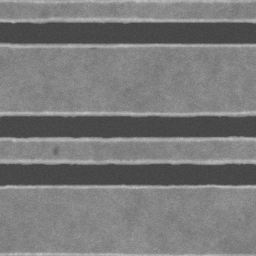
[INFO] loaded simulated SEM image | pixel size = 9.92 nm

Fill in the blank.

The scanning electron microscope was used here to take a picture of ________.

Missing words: lines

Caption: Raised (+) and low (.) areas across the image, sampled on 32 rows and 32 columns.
++++++++++++++++++++++++++++++++
++++++++++++++++++++++++++++++++
++++++++++++++++++++++++++++++++
................................
................................
................................
++++++++++++++++++++++++++++++++
++++++++++++++++++++++++++++++++
++++++++++++++++++++++++++++++++
++++++++++++++++++++++++++++++++
++++++++++++++++++++++++++++++++
++++++++++++++++++++++++++++++++
++++++++++++++++++++++++++++++++
++++++++++++++++++++++++++++++++
................................
................................
................................
++++++++++++++++++++++++++++++++
++++++++++++++++++++++++++++++++
++++++++++++++++++++++++++++++++
...........+++.+++......++++....
................................
................................
++++++++++++++++++++++++++++++++
++++++++++++++++++++++++++++++++
++++++++++++++++++++++++++++++++
++++++++++++++++++++++++++++++++
++++++++++++++++++++++++++++++++
++++++++++++++++++++++++++++++++
++++++++++++++++++++++++++++++++
++++++++++++++++++++++++++++++++
++++++++++++++++++++++++++++++++